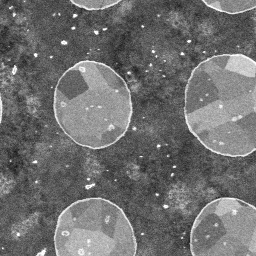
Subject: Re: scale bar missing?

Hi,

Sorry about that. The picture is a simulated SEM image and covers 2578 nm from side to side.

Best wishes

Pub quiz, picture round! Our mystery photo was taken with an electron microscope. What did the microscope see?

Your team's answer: raised bodies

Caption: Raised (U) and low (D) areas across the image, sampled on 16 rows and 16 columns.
DDDDDUUDDDDDDUUU
DDDDDDDDDDDDDDDD
DDDDDDDDDDDDDDDD
DDDDDDDDDDDDDDUD
DDDDUUUDDDDDUUUU
DDDDUUUUDDDDUUUU
DDDUUUUUDDDDUUUU
DDDDUUUUDDDDUUUU
DDDDUUUUDDDDUUUU
DDDDDDDDDDDDDUUU
DDDDDDDDDDDDDDDD
DDDDDDDDDDDDDDDD
DDDDDUUDDDDDDDUD
DDDDUUUUDDDDUUUU
DDDUUUUUDDDDUUUU
DDDUUUUUDDDDUUUU